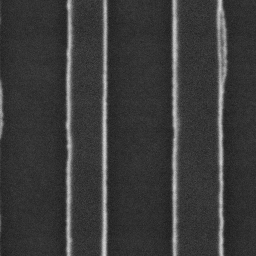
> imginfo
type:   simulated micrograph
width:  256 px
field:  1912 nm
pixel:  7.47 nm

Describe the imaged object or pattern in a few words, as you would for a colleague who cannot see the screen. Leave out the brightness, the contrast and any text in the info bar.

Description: lines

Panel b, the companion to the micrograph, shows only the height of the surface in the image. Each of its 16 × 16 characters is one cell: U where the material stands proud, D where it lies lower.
DDDDUUUDDDDUUUDD
DDDDUUUDDDDUUUDD
DDDDUUUDDDDUUUDD
DDDDUUUDDDDUUUDD
DDDDUUUDDDDUUUDD
DDDDUUUDDDDUUUDD
DDDDUUUDDDDUUUDD
DDDDUUUDDDDUUUDD
DDDDUUUDDDDUUUDD
DDDDUUUDDDDUUUDD
DDDDUUUDDDDUUUDD
DDDDUUUDDDDUUUDD
DDDDUUUDDDDUUUDD
DDDDUUUDDDDUUUDD
DDDDUUUDDDDUUUDD
DDDDUUUDDDDUUUDD